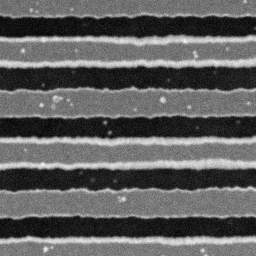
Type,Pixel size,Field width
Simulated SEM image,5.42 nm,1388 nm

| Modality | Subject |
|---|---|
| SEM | lines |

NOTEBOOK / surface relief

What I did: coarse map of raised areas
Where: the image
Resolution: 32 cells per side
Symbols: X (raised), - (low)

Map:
XXXXXXXXXXXXXXXXXXXXXXXXXXXXXXXX
XXXXXXXXXXXXXXXXXXXXXXXXXXXXXXXX
--------------------------------
--------------------------------
--------------------------------
XXXXXXXXXXXXXXXXXXXXXXXXXXXXXXXX
XXXXXXXXXXXXXXXXXXXXXXXXXXXXXXXX
XXXXXXXXXXXXXXXXXXXXXXXXXXXXXXXX
--------------------------------
--------------------------------
--------------------------------
XXXXXXXXXXXXXXXXXXXXXXXXXXXXXXXX
XXXXXXXXXXXXXXXXXXXXXXXXXXXXXXXX
XXXXXXXXXXXXXXXXXXXXXXXXXXXXXXXX
XXXXXXXXXXXXXXXXXXXX-X-XXXXXXXXX
--------------------------------
--------------------------------
XXXXXXXXXXXXX-XXXXXXXXXXXXXXXXXX
XXXXXXXXXXXXXXXXXXXXXXXXXXXXXXXX
XXXXXXXXXXXXXXXXXXXXXXXXXXXXXXXX
XXXXXXXXXXXXXXXXXXXXXXXXXXXXXXXX
--------------------------------
--------------------------------
--------------------------X-----
XXXXXXXXXXXXXXXXXXXXXXXXXXXXXXXX
XXXXXXXXXXXXXXXXXXXXXXXXXXXXXXXX
XXXXXXXXXXXXXXXXXXXXXXXXXXXXXXXX
--------------------------------
--------------------------------
--------------------------------
XXXXXXXXXXXXXXXXXXXXXXXXXXXXXXXX
XXXXXXXXXXXXXXXXXXXXXXXXXXXXXXXX